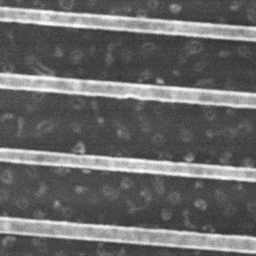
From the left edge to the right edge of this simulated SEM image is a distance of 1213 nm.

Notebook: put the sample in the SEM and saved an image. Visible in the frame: one or a few lines or trenches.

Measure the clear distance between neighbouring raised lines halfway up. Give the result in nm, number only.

270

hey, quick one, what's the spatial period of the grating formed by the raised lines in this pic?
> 70.1 pixels